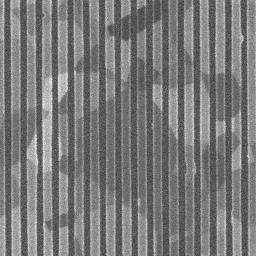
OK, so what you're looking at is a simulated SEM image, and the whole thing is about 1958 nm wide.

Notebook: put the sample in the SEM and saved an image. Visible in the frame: parallel lines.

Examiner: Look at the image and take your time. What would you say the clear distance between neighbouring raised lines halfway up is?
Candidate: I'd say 56.4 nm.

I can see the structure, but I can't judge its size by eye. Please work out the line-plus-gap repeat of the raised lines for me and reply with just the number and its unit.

15.8 pixels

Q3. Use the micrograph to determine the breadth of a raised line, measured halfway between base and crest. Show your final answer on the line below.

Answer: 0.065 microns